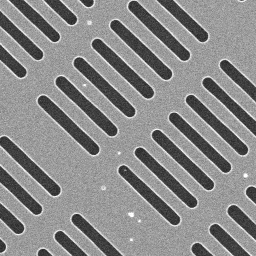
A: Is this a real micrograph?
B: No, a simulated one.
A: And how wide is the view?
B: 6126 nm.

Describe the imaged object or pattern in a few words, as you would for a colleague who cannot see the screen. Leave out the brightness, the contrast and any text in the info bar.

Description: groups of lines, slits or small figures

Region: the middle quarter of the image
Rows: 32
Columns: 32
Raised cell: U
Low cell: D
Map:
UUUDDDDUUUUUDDDDUUUUUDDDDDUUUUUU
UUUUDDDDUUUUUDDDDUUUUUDDDDDUUUUU
UUUUUDDDDUUUUUDDDDUUUUUDDDDUUUUU
DUUUUUDDDDUUUUUDDDDUUUUUDDDUUUUU
DDUUUUUDDDDUUUUUDDDDUUUUUUUUUUUU
DDDUUUUUDDDDUUUUUDDDDDUUUUUUUUUU
DDDDUUUUUDDDDUUUUUDDDDUUUUUUUUUU
DDDDDUUUUUDDDDUUUUUDDDUUUUUUUUUU
UDDDDDUUUUUDDDDUUUUUUUUUUUUUUUUD
UUUDDDDUUUUUDDDDUUUUUUUUUUUUUUUD
UUUUDDDDUUUUUDDDDUUUUUUUUUUUUUUD
UUUUUDDDDUUUUUDDDDUUUUUUUUUUUUUU
DUUUUDDDDDUUUUUDDDUUUUUUUUDDDUUU
DDUUUUDDDDDUUUUUUUUUUUUUUUDDDDUU
DDDUUUUDDDDDUUUUUUUUUUUUUUUDDDDU
DDDDUUUUDDDDDUUUUUUUUUUUUUUUDDDD
DDDDDUUUUUDDDUUUUUUUUUUDUUUUUDDD
UDDDDDUUUUUDDUUUUUUUUUDDDUUUUUDD
UUDDDDDUUUUUUUUUUUUUUUDDDDUUUUUD
UUUDDDDDUUUUUUUUUUUUUUUDDDDUUUUU
UUUUUDDDDUUUUUUUUUUUUUUUDDDDUUUU
UUUUUDDDDUUUUUUUUUDDUUUUUDDDDUUU
UUUUUUDDUUUUUUUUUUDDDUUUUUDDDDUU
UUUUUUUUUUUUUUUUUUDDDDUUUUUDDDDU
UUUUUUUUUUUUUUUUUUUDDDDUUUUUDDDD
UUUUUUUUUUUUUUDDUUUUDDDDUUUUUDDD
UUUUUUUUUUUUUDDDDUUUUDDDDDUUUUDD
UUUUUUUUUUUUUUDDDDUUUUUDDDDUUUUD
UUUUUUUUUUUUUUUDDDDUUUUDDDDDUUUU
UUUUUUUUUUUUUUUUDDDDUUUUUDDDDUUU
UUUUUUUUUUUUUUUUUDDDDUUUUUDDDDUU
UUUUUUUUUUUUUUUUUUDDDDUUUUUDDDDU